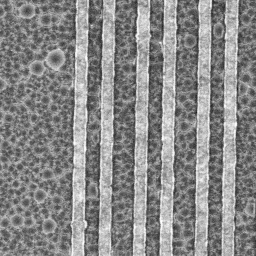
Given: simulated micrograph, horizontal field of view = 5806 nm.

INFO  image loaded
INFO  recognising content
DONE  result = parallel lines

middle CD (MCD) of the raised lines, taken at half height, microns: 0.258